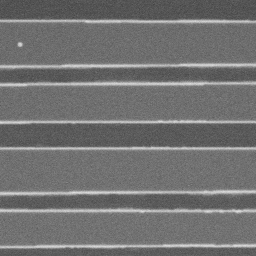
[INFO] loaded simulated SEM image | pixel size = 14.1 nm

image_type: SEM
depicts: lines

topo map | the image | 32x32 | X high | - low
--------------------------------
--------------------------------
--------------------------------
XXXXXXXXXXXXXXXXXXXXXXXXXXXXXXXX
XXXXXXXXXXXXXXXXXXXXXXXXXXXXXXXX
XXXXXXXXXXXXXXXXXXXXXXXXXXXXXXXX
XXXXXXXXXXXXXXXXXXXXXXXXXXXXXXXX
XXXXXXXXXXXXXXXXXXXXXXXXXXXXXXXX
--------------------------------
--------------------------------
------------XXXXXXXXXXXXXXXXXXXX
XXXXXXXXXXXXXXXXXXXXXXXXXXXXXXXX
XXXXXXXXXXXXXXXXXXXXXXXXXXXXXXXX
XXXXXXXXXXXXXXXXXXXXXXXXXXXXXXXX
XXXXXXXXXXXXXXXXXXXXXXXXXXXXXXXX
--------------------------------
--------------------------------
--------------------------------
--------------------------------
XXXXXXXXXXXXXXXXXXXXXXXXXXXXXXXX
XXXXXXXXXXXXXXXXXXXXXXXXXXXXXXXX
XXXXXXXXXXXXXXXXXXXXXXXXXXXXXXXX
XXXXXXXXXXXXXXXXXXXXXXXXXXXXXXXX
XXXXXXXXXXXXXXXXXXXXXXXXXXXXXXXX
--------------------------------
--------------------------------
XXXXXXXXXXXXXXXXXXXXXXXXXXXXXXXX
XXXXXXXXXXXXXXXXXXXXXXXXXXXXXXXX
XXXXXXXXXXXXXXXXXXXXXXXXXXXXXXXX
XXXXXXXXXXXXXXXXXXXXXXXXXXXXXXXX
XXXXXXXXXXXXXXXXXXXXXXXXXXXXXXXX
--------------------------------